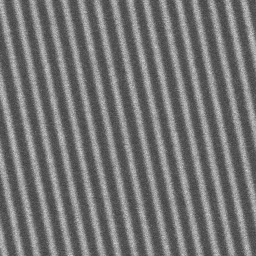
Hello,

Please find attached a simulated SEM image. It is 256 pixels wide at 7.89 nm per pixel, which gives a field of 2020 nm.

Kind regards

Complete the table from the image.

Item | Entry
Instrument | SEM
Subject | parallel lines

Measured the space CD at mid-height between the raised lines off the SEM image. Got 98.4 nm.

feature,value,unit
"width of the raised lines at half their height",32.8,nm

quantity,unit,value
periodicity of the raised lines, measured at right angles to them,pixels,15.9